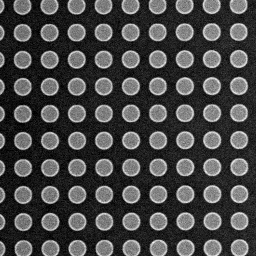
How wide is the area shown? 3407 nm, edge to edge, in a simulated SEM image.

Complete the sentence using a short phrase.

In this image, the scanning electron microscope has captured an array of small figures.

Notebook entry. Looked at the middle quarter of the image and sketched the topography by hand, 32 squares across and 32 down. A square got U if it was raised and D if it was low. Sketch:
DDUUUDDDDUUDDDDUUUDDDDUUUDDDDUUD
DDDDDDDDDDDDDDDDDDDDDDDDDDDDDDDD
DDDDDDDDDDDDDDDDDDDDDDDDDDDDDDDD
DDDDDDDDDDDDDDDDUDDDDDDUDDDDDDUD
DUUUUDDDUUUUDDDUUUUDDDUUUDDDUUUU
DUUUUDDDUUUUDDDUUUUDDUUUUDDDUUUU
DUUUUDDDUUUUDDDUUUUDDDUUUDDDUUUU
DDUUDDDDDUUDDDDDUUDDDDDUDDDDDUUD
DDDDDDDDDDDDDDDDDDDDDDDDDDDDDDDD
DDDDDDDDDDDDDDDDDDDDDDDDDDDDDDDD
DDUUDDDDDUUDDDDDUUDDDDDUDDDDDUUD
DUUUUDDDUUUUDDDUUUUDDDUUUDDDUUUU
DUUUUDDDUUUUDDDUUUUDDDUUUUDDUUUU
DUUUUDDDUUUUDDDUUUDDDDUUUDDDUUUU
DDDDDDDDDDDDDDDDDDDDDDDDDDDDDDDD
DDDDDDDDDDDDDDDDDDDDDDDDDDDDDDDD
DDDDDDDDDDDDDDDDDDDDDDDDDDDDDDDD
DDUUUDDDDUUDDDDUUUDDDDUUUDDDDUUU
DUUUUDDDUUUUDDDUUUUDDDUUUUDDUUUU
DUUUUDDDUUUUDDDUUUUDDDUUUUDDUUUU
DDUUUDDDUUUUDDDUUUDDDDUUUDDDDUUU
DDDDDDDDDDDDDDDDDDDDDDDDDDDDDDDD
DDDDDDDDDDDDDDDDDDDDDDDDDDDDDDDD
DDDDDDDDDDDDDDDDDDDDDDDDDDDDDDDD
DDUUUDDDUUUUDDDUUUDDDDUUUDDDDUUU
DUUUUDDDUUUUDDDUUUUDDDUUUUDDUUUU
DUUUUDDDUUUUDDDUUUUDDDUUUUDDUUUU
DDUUUDDDDUUDDDDDUUDDDDUUUDDDDUUU
DDDDDDDDDDDDDDDDDDDDDDDDDDDDDDDD
DDDDDDDDDDDDDDDDDDDDDDDDDDDDDDDD
DDDDDDDDDDDDDDDDDDDDDDDDDDDDDDDD
DDUUUDDDUUUUDDDUUUUDDDUUUDDDUUUU